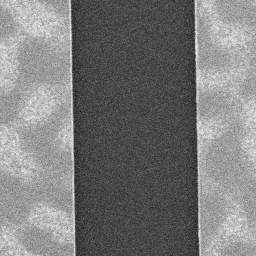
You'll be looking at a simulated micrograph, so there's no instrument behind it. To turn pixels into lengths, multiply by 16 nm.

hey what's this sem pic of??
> one or a few lines or trenches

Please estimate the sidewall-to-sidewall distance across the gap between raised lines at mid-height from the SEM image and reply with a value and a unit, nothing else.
2 microns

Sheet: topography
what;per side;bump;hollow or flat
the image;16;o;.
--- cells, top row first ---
oooo........oooo
oooo........oooo
oooo........oooo
oooo........oooo
oooo........oooo
oooo........oooo
oooo........oooo
ooooo.......oooo
ooooo.......oooo
ooooo.......oooo
ooooo.......oooo
ooooo.......oooo
ooooo.......oooo
ooooo.......oooo
ooooo.......oooo
ooooo........ooo